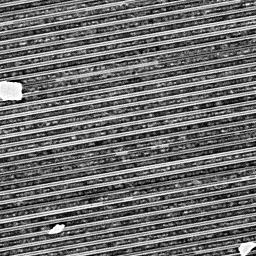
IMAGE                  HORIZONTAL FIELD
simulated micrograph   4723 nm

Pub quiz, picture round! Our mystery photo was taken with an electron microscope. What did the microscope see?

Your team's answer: parallel lines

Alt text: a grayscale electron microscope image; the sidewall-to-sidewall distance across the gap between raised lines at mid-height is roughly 127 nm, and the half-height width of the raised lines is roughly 36.4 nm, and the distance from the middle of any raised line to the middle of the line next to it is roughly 171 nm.